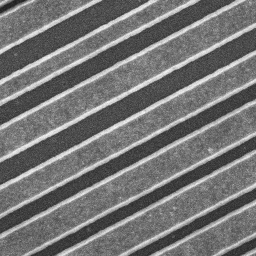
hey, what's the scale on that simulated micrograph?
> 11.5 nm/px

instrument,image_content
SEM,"parallel lines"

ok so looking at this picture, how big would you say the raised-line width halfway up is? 344 nm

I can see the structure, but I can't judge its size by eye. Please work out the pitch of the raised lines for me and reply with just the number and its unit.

544 nanometres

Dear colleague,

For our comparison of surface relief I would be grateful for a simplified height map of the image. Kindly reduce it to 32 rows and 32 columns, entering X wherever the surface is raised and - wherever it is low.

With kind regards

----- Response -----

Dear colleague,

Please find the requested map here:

---XXXXXXXX-------XXXXXX-----XXX
-XXXXXXXX-------XXXXXX-----XXXXX
XXXXXXXX-------XXXXX-----XXXXXXX
XXXXXX-------XXXXX-----XXXXXXXX-
XXXX-------XXXXX------XXXXXXX---
XX-------XXXXX------XXXXXXXX----
-------XXXXX------XXXXXXXX------
-----XXXXXX-----XXXXXXXX------XX
---XXXXXX-----XXXXXXXX------XXXX
-XXXXXX-----XXXXXXXX------XXXXXX
XXXXX-----XXXXXXXX------XXXXXXX-
XXX-----XXXXXXXX------XXXXXXX---
X-----XXXXXXXXX------XXXXXXX----
-----XXXXXXX-------XXXXXXX----XX
---XXXXXXXX------XXXXXXX----XXXX
-XXXXXXXX------XXXXXXX-----XXXXX
XXXXXXX------XXXXXXX-----XXXXXXX
XXXXX------XXXXXXX-----XXXXXXXX-
XXX------XXXXXXX-----XXXXXXXX---
X------XXXXXXX-----XXXXXXXX----X
-----XXXXXXX-----XXXXXXXX----XXX
----XXXXXXX----XXXXXXXX----XXXXX
--XXXXXXX----XXXXXXXX----XXXXXXX
XXXXXXX----XXXXXXXX----XXXXXXXXX
XXXXX-----XXXXXXX----XXXXXXXXX--
XXX----XXXXXXXXX---XXXXXXXXX---X
X-----XXXXXXXX----XXXXXXXX---XXX
----XXXXXXXX----XXXXXXXX----XXXX
--XXXXXXXX----XXXXXXXX----XXXXXX
XXXXXXXX----XXXXXXXX----XXXXXXXX
XXXXXX----XXXXXXXX----XXXXXXXX--
XXXX----XXXXXXXX----XXXXXXXX---X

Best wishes